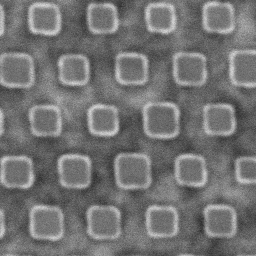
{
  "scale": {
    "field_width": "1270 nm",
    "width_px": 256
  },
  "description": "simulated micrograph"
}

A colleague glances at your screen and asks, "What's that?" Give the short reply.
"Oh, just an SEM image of a regular array of raised bodies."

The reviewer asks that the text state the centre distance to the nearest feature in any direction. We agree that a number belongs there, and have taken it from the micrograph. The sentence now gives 57.8 px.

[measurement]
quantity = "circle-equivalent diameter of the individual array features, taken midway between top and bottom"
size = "160 nanometres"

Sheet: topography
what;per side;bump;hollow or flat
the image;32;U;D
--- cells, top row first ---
DDDDDDDDDDDDDDDDDDDDDDDDDDUUUDDD
DDDDUUUDDDDUUUDDDDUUUUDDDUUUUDDD
DDDDUUUDDDDUUUDDDDUUUUDDDDUUUDDD
DDDDUUUDDDDUUUDDDDDUUUDDDDUUUDDD
DDDDDDDDDDDDDDDDDDDDDDDDDDDDDDDD
DDDDDDDDDDDDDDDDDDDDDDDDDDDDDDDD
DDDDDDDDDDDDDDDDDDDDDDDDDDDDDUUU
UUUUDDDDUUUDDDDUUUDDDDUUUUDDDUUU
UUUUDDDDUUUDDDDUUUDDDDUUUUDDDUUU
UUUUDDDDUUUDDDDUUUDDDDUUUUDDDUUU
DUUUDDDDUDDDDDDDDDDDDDDUUDDDDDUU
DDDDDDDDDDDDDDDDDDDDDDDDDDDDDDDD
DDDDDDDDDDDDDDDDDDDDDDDDDDDDDDDD
DDDDUUUDDDDDUUDDDDUUUUDDDDUUUDDD
DDDDUUUDDDDUUUUDDDUUUUDDDDUUUDDD
DDDDUUUUDDDUUUUDDDUUUUDDDDUUUDDD
DDDDUUUDDDDDUUDDDDUUUUDDDDUUUDDD
DDDDDDDDDDDDDDDDDDDDDDDDDDDDDDDD
DDDDDDDDDDDDDDDDDDDDDDDDDDDDDDDD
DDDDDDDDDDDDDDDUUUDDDDDDDDDDDDDD
UUUUDDDUUUUDDDUUUUUDDDUUUUDDDDUU
UUUUDDDDUUUDDDUUUUUDDDUUUUDDDDUU
UUUUDDDDUUUDDDDUUUUDDDUUUUDDDDUU
DDDDDDDDDDDDDDDDDDDDDDDDDDDDDDDD
DDDDDDDDDDDDDDDDDDDDDDDDDDDDDDDD
DDDDDDDDDDDDDDDDDDDDDDDDDDDDDDDD
DDDDUUUUDDDUUUUDDDUUUUDDDDUUUDDD
DDDDUUUUDDDUUUUDDDUUUUDDDDUUUDDD
DDDDUUUUDDDUUUUDDDDUUUDDDDUUUDDD
DDDDUUUDDDDDUUUDDDDUUDDDDDDDDDDD
DDDDDDDDDDDDDDDDDDDDDDDDDDDDDDDD
DDDDDDDDDDDDDDDDDDDDDDDDDDDDDDDD